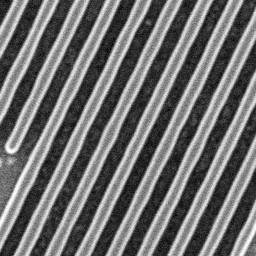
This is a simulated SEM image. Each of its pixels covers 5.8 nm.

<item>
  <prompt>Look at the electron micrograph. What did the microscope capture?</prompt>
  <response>groups of lines, slits or small figures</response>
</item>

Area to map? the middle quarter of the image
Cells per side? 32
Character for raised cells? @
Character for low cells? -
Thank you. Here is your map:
---@@@----@@@@----@@@-----@@@---
--@@@@----@@@-----@@@----@@@@---
--@@@-----@@@----@@@-----@@@----
-@@@@----@@@-----@@@----@@@@----
-@@@----@@@@----@@@-----@@@-----
@@@@----@@@-----@@@----@@@@----@
@@@-----@@@----@@@@----@@@-----@
@@@----@@@-----@@@-----@@@----@@
@@-----@@@----@@@@----@@@-----@@
@@----@@@-----@@@----@@@@----@@@
@-----@@@----@@@@----@@@-----@@@
@----@@@-----@@@-----@@@----@@@@
-----@@@----@@@-----@@@-----@@@-
----@@@-----@@@----@@@@----@@@@-
----@@@----@@@@----@@@@----@@@--
---@@@-----@@@-----@@@----@@@---
---@@@----@@@@----@@@-----@@@---
--@@@-----@@@-----@@@----@@@@---
--@@@----@@@@----@@@-----@@@----
-@@@@----@@@-----@@@----@@@@----
-@@@-----@@@----@@@-----@@@-----
@@@@----@@@-----@@@----@@@@----@
@@@-----@@@----@@@-----@@@-----@
@@@----@@@-----@@@----@@@@----@@
@@-----@@@----@@@@----@@@-----@@
@@----@@@-----@@@----@@@@----@@@
@-----@@@----@@@@----@@@-----@@@
@----@@@-----@@@-----@@@----@@@-
-----@@@----@@@@----@@@-----@@@-
----@@@-----@@@----@@@@----@@@--
----@@@----@@@@----@@@-----@@@--
---@@@-----@@@----@@@@----@@@@--